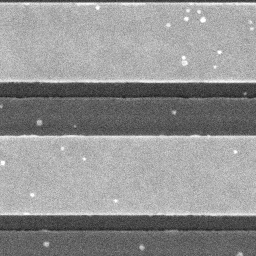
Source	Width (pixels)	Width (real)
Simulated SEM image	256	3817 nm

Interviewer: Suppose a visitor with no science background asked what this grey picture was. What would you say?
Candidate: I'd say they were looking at lines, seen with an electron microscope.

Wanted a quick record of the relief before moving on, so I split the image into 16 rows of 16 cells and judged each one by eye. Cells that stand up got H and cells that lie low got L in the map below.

HHHHHHHHHHHHHHHH
HHHHHHHHHHHHHHHH
HHHHHHHHHHHHHHHH
HHHHHHHHHHHHHHHH
HHHHHHHHHHHHHHHH
LLLLLLLLLLLLLLLL
LLLLLLLLLLLLLLLL
LLLLLLLLLLLLLLLL
LLLLHLLLLLLLLLLL
HHHHHHHHHHHHHHHH
HHHHHHHHHHHHHHHH
HHHHHHHHHHHHHHHH
HHHHHHHHHHHHHHHH
LLLLLLLLLLLLLLLL
LLLLLLLLLLLLLLLL
LLLLLLLLLLLLLLLL